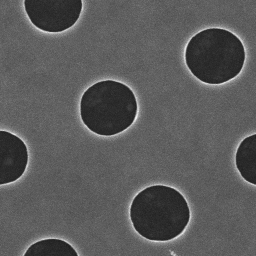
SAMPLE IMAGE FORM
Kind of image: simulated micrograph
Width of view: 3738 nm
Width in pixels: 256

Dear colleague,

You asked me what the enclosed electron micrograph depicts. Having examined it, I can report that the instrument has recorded holes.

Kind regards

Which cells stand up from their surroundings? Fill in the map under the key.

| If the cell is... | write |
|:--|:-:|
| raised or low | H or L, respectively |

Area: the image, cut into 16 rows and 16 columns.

HHLLLHHHHHHHHHHH
HHLLLHHHHHHHHHHH
HHHHHHHHHHHHLLLH
HHHHHHHHHHHHLLLH
HHHHHHHHHHHHLLLH
HHHHHHLLHHHHHHHH
HHHHHLLLLHHHHHHH
HHHHHLLLHHHHHHHH
LHHHHHHHHHHHHHHH
LLHHHHHHHHHHHHHL
LLHHHHHHHHHHHHHL
HHHHHHHHHHHHHHHH
HHHHHHHHLLLLHHHH
HHHHHHHHLLLLHHHH
HHHHHHHHHLLHHHHH
HHLLLHHHHHHHHHHH